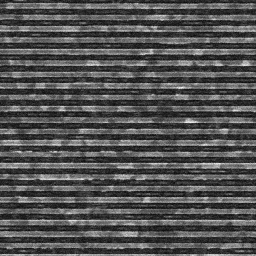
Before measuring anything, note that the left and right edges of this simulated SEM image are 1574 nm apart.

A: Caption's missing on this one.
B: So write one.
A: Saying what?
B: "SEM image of parallel lines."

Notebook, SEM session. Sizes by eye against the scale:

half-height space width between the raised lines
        39.2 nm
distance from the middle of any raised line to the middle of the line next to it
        70.2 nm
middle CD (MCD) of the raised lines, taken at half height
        27.7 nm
